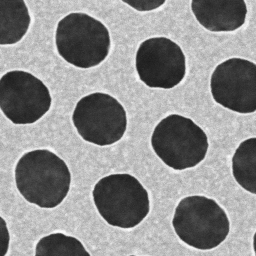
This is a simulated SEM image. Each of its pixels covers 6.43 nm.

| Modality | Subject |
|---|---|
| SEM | holes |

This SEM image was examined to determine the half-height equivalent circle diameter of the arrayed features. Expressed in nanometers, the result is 354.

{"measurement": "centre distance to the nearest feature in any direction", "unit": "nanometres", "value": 524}